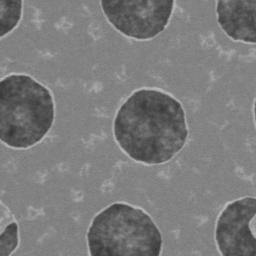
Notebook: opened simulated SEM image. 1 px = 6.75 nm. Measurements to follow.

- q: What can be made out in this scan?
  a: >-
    holes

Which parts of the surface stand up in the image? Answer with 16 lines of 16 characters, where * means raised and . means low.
.*****.....***..
.******...****..
***************.
****************
****************
...*************
...*****...*****
...****.....****
...****.....****
********...*****
****************
****************
***************.
******...*****..
.*****....***...
.*****....****..